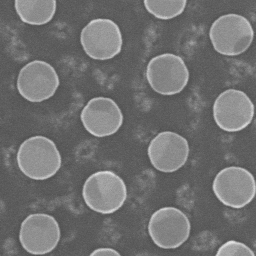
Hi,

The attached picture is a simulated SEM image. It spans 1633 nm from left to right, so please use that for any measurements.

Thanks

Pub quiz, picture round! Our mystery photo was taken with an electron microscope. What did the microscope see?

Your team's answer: a regular array of raised bodies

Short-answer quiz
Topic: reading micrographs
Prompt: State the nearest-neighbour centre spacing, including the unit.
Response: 475 nanometers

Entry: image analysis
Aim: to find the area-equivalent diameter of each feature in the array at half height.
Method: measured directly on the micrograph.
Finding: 258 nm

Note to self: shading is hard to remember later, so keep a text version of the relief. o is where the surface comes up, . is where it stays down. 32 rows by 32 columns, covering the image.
..ooooo...........ooooo.........
..ooooo............oooo.........
...ooo......o..............oooo.
...........oooo...........ooooo.
..........ooooo...........oooooo
..........ooooo............oooo.
...........oooo............ooo..
...................oooo.........
...ooo............ooooo.........
..ooooo...........ooooo.........
..ooooo............oooo.........
..ooooo.............oo......oo..
....o.......oo.............oooo.
...........oooo............ooooo
..........ooooo............ooooo
..........ooooo............oooo.
...........ooo..................
....oo.............oooo.........
...oooo............ooooo........
..ooooo............oooo.........
..oooooo...........oooo.........
...oooo.....................ooo.
...........oooo............ooooo
..........oooooo...........ooooo
..........oooooo...........ooooo
...........oooo.............ooo.
.............o......ooo.........
...oooo............oooo.........
...oooo............ooooo........
...oooo............oooo.........
...oooo.............ooo.....oo..
....oo......oo.............oooo.